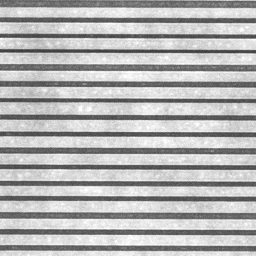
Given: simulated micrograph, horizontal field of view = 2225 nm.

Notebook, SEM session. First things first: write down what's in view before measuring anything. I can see parallel lines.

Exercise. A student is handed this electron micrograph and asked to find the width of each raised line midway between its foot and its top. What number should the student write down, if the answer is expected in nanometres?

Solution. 88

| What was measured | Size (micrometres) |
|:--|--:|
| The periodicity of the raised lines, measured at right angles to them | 0.141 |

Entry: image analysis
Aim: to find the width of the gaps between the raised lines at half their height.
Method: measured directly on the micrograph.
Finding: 0.0478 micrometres